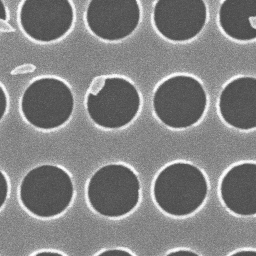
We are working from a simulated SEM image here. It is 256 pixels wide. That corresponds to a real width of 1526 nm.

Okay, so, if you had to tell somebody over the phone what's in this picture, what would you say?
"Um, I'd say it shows holes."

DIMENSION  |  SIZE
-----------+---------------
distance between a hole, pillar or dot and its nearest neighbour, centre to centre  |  395 nanometers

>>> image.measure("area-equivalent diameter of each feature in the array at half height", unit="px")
52.2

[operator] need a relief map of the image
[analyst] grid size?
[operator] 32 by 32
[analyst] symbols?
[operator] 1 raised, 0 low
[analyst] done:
11100000011000000110000000110000
01100000011000000110000000100000
11100000011000000110000000100001
11100000011000000111000001110000
11110000111100001111000011111000
11111111111111111111111111111111
11111111111111111111111111111111
11111111111111111111111111111111
11111111111111111111111111111111
11111111111111111111110111111111
11110000111110001111000001111000
11100000011100000111000000110000
01100000011000000110000000100000
01100000011000000110000000100000
11100000011000000111000001110000
11110000111100001111100011111000
11111111111111111111111111111111
11111111111111111111111111111111
11111111111111111111111111111111
11111111111111111111111111111111
11111111111111011111110011111100
11110000111100000111000001111000
01100000011000000111000000110000
01100000011000000110000000110000
01100000011000000110000000110000
11100000011000000111000001110000
11110000111100001111100011111000
11111111111111111111111111111111
11111111111111111111111111111111
11111111111111111111111111111111
11111111111111111111111111111111
11111111111110001111110011111100